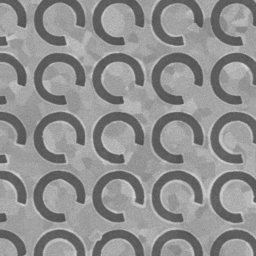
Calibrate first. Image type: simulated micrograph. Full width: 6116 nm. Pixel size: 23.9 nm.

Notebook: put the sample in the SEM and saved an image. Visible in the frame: an array of small figures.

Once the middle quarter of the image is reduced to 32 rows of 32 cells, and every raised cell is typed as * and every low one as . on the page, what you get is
**...***...*****....**....*****.
**...**...*******...**...*******
***...*...*******...**..********
***...*...*******...**..********
***...*...********..**..********
****.**...*********.**..********
********...***********...*******
********....***********....*****
*********......*********......**
.**********....**********.....**
********************************
********************************
..********.......********......*
...******.........******........
....****.....**....****....***..
**...**....*****...***...******.
***..**...*******...**...*******
***...*...*******...**..********
***...*...********..**..********
***..**...********..**..********
*******...*********.**...*******
********...***********....******
********.......********......***
.********......*********......**
.**********....***********....**
********************************
*************..************..***
..********.......********.......
....*****..........*****........
*...****...*****...****....**...
**...***...******...**...******.
***..**...*******...**...*******